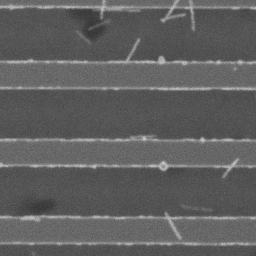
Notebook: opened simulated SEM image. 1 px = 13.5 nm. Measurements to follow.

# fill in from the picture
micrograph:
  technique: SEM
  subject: lines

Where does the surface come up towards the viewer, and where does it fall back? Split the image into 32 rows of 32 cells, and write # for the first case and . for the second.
################################
................................
................................
................................
................................
................................
................................
....................#...........
################################
################################
################################
................................
................................
................................
................................
................................
................................
########.###########..#########.
################################
################################
################################
................................
................................
................................
................................
................................
................................
################################
################################
################################
...##..#...#..###.#.##.#########
................................